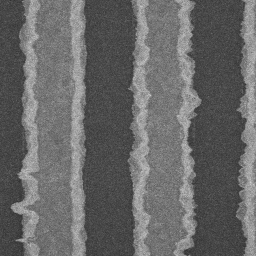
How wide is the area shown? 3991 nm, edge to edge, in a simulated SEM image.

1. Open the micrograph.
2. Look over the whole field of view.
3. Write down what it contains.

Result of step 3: one or a few lines or trenches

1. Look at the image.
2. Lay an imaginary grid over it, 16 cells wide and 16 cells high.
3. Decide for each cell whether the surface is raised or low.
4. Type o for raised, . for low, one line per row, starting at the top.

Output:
..ooo....ooo....
..ooo....ooo....
..ooo....ooo....
..ooo....oo.....
..ooo....ooo....
..ooo....ooo....
..ooo....ooo....
..ooo....ooo....
..ooo....ooo....
..ooo....ooo....
..ooo....ooo....
..ooo....ooo....
..ooo....ooo....
..ooo....ooo....
..ooo....ooo....
..ooo....oo.....